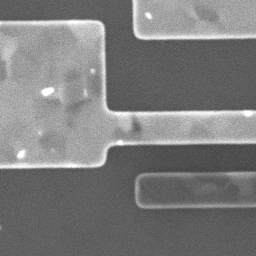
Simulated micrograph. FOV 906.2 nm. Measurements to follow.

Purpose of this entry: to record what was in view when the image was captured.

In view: wiring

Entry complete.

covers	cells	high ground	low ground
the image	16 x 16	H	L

LLLLLLLLHHHHHHHH
HHHHHHLLHHHHHHHH
HHHHHHHLLLLLLLLL
HHHHHHHLLLLLLLLL
HHHHHHHLLLLLLLLL
HHHHHHHLLLLLLLLL
HHHHHHHLLLLLLLLL
HHHHHHHHHHHHHHHH
HHHHHHHHHHHHHHHH
HHHHHHHLLLLLLLLL
HLLLLLLLLLLLLLLL
LLLLLLLLLHHHHHHH
LLLLLLLLLHHHHHHH
LLLLLLLLLLLLLLLL
LLLLLLLLLLLLLLLL
LLLLLLLLLLLLLLLL